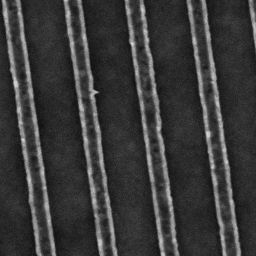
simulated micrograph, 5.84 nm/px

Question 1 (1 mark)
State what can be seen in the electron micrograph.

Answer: one or a few lines or trenches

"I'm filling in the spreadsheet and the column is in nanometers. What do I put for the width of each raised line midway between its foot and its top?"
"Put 82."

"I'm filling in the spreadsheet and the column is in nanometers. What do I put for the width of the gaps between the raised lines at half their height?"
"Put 275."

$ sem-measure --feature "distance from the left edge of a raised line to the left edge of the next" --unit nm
357